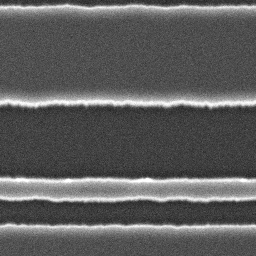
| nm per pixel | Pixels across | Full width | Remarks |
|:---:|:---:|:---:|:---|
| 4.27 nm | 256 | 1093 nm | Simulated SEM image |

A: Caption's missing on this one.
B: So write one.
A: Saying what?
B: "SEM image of lines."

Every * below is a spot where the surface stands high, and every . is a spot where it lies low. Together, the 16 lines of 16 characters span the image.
****************
****************
****************
****************
****************
****************
.............*..
................
................
................
................
****************
****************
****************
****************
****************